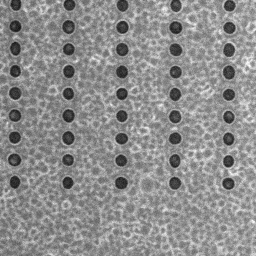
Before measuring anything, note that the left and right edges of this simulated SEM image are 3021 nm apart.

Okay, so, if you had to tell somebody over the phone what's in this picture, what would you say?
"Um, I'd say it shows a regular array of holes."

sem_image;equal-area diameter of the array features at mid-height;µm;0.152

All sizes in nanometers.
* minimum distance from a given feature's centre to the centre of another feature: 261